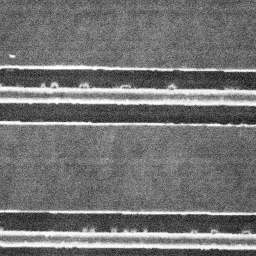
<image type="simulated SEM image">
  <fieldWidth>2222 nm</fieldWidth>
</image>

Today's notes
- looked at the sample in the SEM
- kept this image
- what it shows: lines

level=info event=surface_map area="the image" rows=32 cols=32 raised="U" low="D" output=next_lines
UUUUUUUUUUUUUUUUUUUUUUUUUUUUUUUU
UUUUUUUUUUUUUUUUUUUUUUUUUUUUUUUU
UUUUUUUUUUUUUUUUUUUUUUUUUUUUUUUU
UUUUUUUUUUUUUUUUUUUUUUUUUUUUUUUU
UUUUUUUUUUUUUUUUUUUUUUUUUUUUUUUU
UUUUUUUUUUUUUUUUUUUUUUUUUUUUUUUU
UUUUUUUUUUUUUUUUUUUUUUUUUUUUUUUU
UUUUUUUUUUUUUUUUUUUUUUUUUUUUUUUU
DDDDDDDDDDUUUUUUUUUUUUUUUUUUUUUU
DDDDDDDDDDDDDDDDDDDDDDDDDDDDDDDD
DDDDDDDDDDDDDDDDDDDDDDDDDDDDDDDD
UUUUUUUUUUUUUUUUUUUUUUUUUUUUUUUU
UUUUUUUUUUUUUUUUUUUUUUUUUUUUUUUU
DDDDDDDDDDDDDDDDDDDDDDDDDDDDDDDD
DDDDDDDDDDDDDDDDDDDDDDDDDDDDDDDD
UUUUUUUUUUUUUUUUUUUUUDDDDDDDDDDD
UUUUUUUUUUUUUUUUUUUUUUUUUUUUUUUU
UUUUUUUUUUUUUUUUUUUUUUUUUUUUUUUU
UUUUUUUUUUUUUUUUUUUUUUUUUUUUUUUU
UUUUUUUUUUUUUUUUUUUUUUUUUUUUUUUU
UUUUUUUUUUUUUUUUUUUUUUUUUUUUUUUU
UUUUUUUUUUUUUUUUUUUUUUUUUUUUUUUU
UUUUUUUUUUUUUUUUUUUUUUUUUUUUUUUU
UUUUUUUUUUUUUUUUUUUUUUUUUUUUUUUU
UUUUUUUUUUUUUUUUUUUUUUUUUUUUUUUU
UUUUUUUUUUUUUUUUUUUUUUUUUUUUUUUU
DDDDDDUUUUUUUUUUUUUUUUUUUUUUUUUU
DDDDDDDDDDDDDDDDDDDDDDDDDDDDDDDD
DDDDDDDDDDDDDDDDDDDDDDDDDDDDDDDD
UUUUUUUUUUUUUUUUUUUUUUUUUUUUUUUU
UUUUUUUUUUUUUUUUUUUUUUUUUUUUUUUU
DDDDDDDDDDDDDDDDDDDDDDDDDDDDDDDD